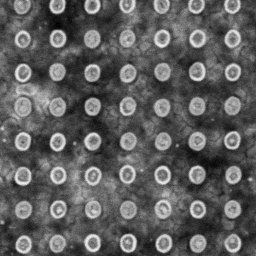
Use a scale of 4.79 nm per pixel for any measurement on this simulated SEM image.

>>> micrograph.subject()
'a regular array of raised bodies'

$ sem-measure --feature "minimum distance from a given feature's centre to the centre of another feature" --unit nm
161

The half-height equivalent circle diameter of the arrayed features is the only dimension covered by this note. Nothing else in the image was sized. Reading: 81.4 nm